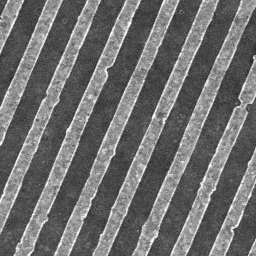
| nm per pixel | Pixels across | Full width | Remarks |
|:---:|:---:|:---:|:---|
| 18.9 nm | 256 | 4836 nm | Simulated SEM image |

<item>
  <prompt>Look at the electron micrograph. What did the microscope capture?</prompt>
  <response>parallel lines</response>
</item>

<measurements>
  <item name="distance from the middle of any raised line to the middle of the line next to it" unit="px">35.7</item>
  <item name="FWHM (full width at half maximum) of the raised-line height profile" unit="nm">238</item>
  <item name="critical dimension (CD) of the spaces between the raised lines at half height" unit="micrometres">0.429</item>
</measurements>